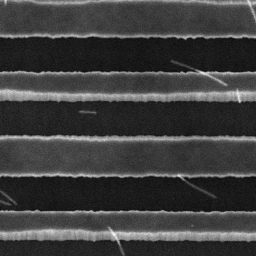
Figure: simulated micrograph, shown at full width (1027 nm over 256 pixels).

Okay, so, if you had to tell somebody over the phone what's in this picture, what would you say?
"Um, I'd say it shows lines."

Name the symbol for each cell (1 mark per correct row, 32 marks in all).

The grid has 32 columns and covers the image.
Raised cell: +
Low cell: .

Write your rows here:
++++++++++++++++++++++++++++++++
++++++++++++++++++++++++++++++++
++++++++++++++++++++++++++++++++
++++++++++++++++++++++++++++++++
++++++++++++++++++++++++++++++++
................................
................................
................................
................................
++++++++++++++++++++++++++++++++
++++++++++++++++++++++++++++++++
++++++++++++++++++++++++++++++++
................................
................................
................................
................................
................................
++++++++++++++++++++++++++++++++
++++++++++++++++++++++++++++++++
++++++++++++++++++++++++++++++++
++++++++++++++++++++++++++++++++
++++++++++++++++++++++++++++++++
................................
................................
................................
................................
++++++++++++++++++++++++++++++++
++++++++++++++++++++++++++++++++
++++++++++++++++++++++++++++++++
++++.+....++++++++++++++++++++++
................................
................................